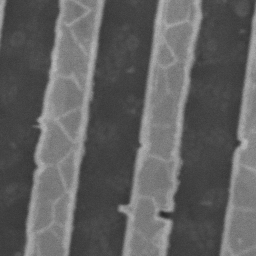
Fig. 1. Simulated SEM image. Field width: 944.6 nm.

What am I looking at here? one or a few lines or trenches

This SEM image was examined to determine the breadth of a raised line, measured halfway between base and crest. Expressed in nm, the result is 143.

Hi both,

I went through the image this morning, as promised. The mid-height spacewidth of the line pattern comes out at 218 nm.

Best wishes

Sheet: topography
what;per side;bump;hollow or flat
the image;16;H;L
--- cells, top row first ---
LLLLHHLLLLHHLLLL
LLLLHHLLLLHHLLLL
LLLLHHLLLLHHLLLL
LLLHHHLLLLHHLLLL
LLLHHHLLLHHHLLLH
LLLHHHLLLHHHLLLH
LLLHHLLLLHHLLLLH
LLLHHLLLLHHLLLLH
LLLHHLLLLHHLLLLH
LLHHHLLLLHHLLLLH
LLHHHLLLLHHLLLLH
LLHHHLLLHHHLLLLH
LLHHHLLLHHHLLLHH
LLHHLLLLHHLLLLHH
LLHHLLLLHHLLLLHH
LLHHLLLLHHLLLLHH